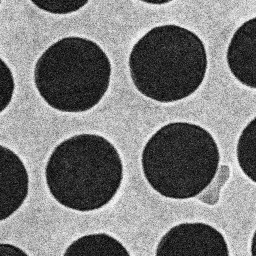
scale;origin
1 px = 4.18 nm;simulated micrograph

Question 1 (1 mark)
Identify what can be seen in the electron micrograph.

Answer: holes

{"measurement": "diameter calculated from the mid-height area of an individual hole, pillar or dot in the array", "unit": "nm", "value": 321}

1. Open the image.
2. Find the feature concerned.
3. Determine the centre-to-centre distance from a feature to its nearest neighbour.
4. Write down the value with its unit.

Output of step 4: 0.403 µm